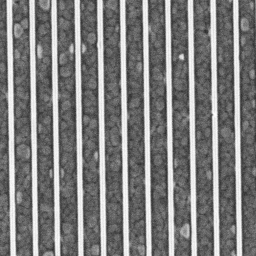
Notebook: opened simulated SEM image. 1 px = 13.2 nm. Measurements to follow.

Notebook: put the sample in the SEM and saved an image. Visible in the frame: parallel lines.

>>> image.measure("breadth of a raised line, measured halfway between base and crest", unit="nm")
47.9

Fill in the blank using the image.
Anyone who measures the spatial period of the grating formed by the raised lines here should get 299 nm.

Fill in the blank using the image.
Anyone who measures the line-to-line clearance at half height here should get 253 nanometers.